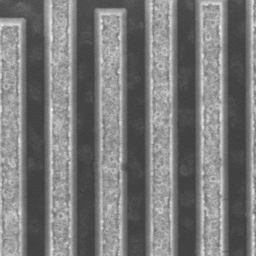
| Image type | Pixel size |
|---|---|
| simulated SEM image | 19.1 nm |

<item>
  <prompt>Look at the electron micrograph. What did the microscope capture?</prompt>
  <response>parallel lines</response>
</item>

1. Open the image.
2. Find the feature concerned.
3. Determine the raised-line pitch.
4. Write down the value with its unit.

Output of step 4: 965 nm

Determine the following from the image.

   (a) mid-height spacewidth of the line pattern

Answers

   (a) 0.488 microns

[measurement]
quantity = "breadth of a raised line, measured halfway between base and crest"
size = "488 nanometers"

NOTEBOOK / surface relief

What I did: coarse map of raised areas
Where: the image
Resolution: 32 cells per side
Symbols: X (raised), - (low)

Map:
------XXX----------XXX---XXX---X
------XXX----XX----XXX---XXX---X
------XXX---XXX----XXX---XXX---X
XXX---XXX---XXX----XXX---XXX---X
XXX---XXX---XXX----XXX---XXX---X
XXX---XXX---XXX----XXX---XXX---X
XXX---XXX---XXX----XXX---XXX---X
XXX---XXX---XXX----XXX---XXX---X
XXX---XXX---XXX----XXX---XXX---X
XXX---XXX---XXX----XXX---XXX---X
XXX---XXX---XXX----XXX---XXX---X
XXX---XXX---XXX----XXX---XXX---X
XXX---XXX---XXX----XXX---XXX---X
XXX---XXX---XXX----XXX---XXX---X
XXX---XXX---XXX----XXX---XXX---X
XXX---XXX---XXX----XXX---XXX---X
XXX---XXX---XXX----XXX---XXX---X
XXX---XXX---XXX----XXX---XXX---X
XXX---XXX---XXX----XXX---XXX---X
XXX---XXX---XXX----XXX---XXX---X
XXX---XXX---XXX----XXX---XXX---X
XXX---XXX---XXX----XXX---XXX---X
XXX---XXX---XXX----XXX---XXX---X
XXX---XXX---XXX----XXX---XXX---X
XXX---XXX---XXX----XXX---XXX---X
XXX---XXX---XXX----XXX---XXX---X
XXX---XXX---XXX----XXX---XXX---X
XXX---XXX---XXX----XXX---XXX---X
XXX---XXX---XXX----XXX---XXX---X
XXX---XXX---XXX----XXX---XXX---X
XXX---XXX---XXX----XXX---XXX---X
XXX---XXX---XXX----XXX---XXX---X